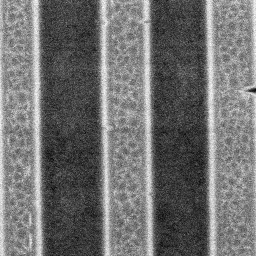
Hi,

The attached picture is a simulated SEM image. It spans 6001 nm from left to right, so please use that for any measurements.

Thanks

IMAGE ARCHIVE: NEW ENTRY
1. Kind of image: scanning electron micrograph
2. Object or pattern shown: one or a few lines or trenches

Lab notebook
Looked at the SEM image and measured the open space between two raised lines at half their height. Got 1.51 micrometres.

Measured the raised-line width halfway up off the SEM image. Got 1040 nm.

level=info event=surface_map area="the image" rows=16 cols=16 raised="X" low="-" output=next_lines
XX----XXX----XXX
XX----XXX----XXX
XX----XXX----XXX
XX----XXX----XXX
XX-----XX----XXX
XX-----XX----XXX
XX-----XX----XXX
XX-----XX----XXX
XX-----XX----XXX
XX-----XX----XXX
XX-----XX----XXX
XX-----XX----XXX
XX-----XX----XXX
XX-----XX----XXX
XX-----XX----XXX
XX-----XX----XXX